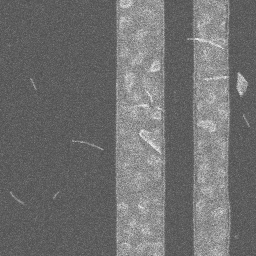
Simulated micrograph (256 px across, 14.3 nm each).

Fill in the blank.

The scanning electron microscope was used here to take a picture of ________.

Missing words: one or a few lines or trenches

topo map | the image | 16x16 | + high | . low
+++++++...++..++
+++++++...++..++
+++++++...++..++
+++++++...++..++
+++++++...++..++
+++++++...++..++
+++++++...++..++
+++++++...++..++
+++++++...++..++
+++++++...++..++
+++++++...++..++
+++++++...++..++
+++++++...++..++
+++++++...++..++
+++++++...++..++
+++++++...++..++